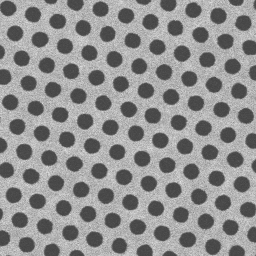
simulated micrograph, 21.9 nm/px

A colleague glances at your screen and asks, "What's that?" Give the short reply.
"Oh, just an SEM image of a regular array of holes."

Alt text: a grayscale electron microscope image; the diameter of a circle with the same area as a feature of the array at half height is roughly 356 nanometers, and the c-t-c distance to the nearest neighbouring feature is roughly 554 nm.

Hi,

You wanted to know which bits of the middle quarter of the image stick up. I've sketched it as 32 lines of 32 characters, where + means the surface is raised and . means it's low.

...+++++++++..+++....+++..++++++
....++++.++++++++....++....+++++
....++....++++++++..+++....+++..
+..+++....+++..+++++++++...++...
++++++....++....++++++++++++++..
++++++++++++....+++...++++++++..
++...++++++++..+++.....+++..++++
++....+++++++++++++...+++....+++
++....++...+++++++++.++++....++.
++...+++....+++..++++++++...+++.
++++++++....++....+++++++++++++.
.++++++++..+++....+++...++++++++
.+++..+++++++++...++....++++++++
.++....+++++++++++++....+++...++
+++....+++...++++++++..++++....+
++++...+++....+++..++++++++...++
+++++++++.....++....++++++++..++
..++++++++...+++....+++..+++++++
...+++++++++++++....++....++++++
...++....+++++++++++++....+++...
..+++....+++...++++++++...++....
+++++....++....+++++++++++++....
+++++++++++....+++...++++++++..+
+...++++++++...++.....+++..+++++
+....+++++++++++++...+++....++++
+....++...+++++++++.++++....++..
+...+++....+++..++++++++....++..
+++++++....++....+++++++++++++..
++++++++..+++....+++...++++++++.
++++.++++++++....++....++++.++++
++....+++++++++++++....+++...+++
++....+++...++++++++..+++....+++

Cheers